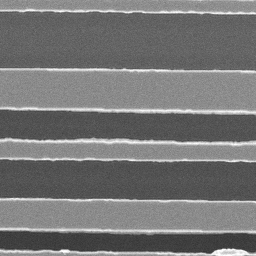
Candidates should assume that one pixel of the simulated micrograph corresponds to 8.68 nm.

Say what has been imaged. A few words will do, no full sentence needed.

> lines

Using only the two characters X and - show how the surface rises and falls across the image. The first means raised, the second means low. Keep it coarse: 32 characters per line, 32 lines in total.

XXXXXXXXXXXXXXXXXXXXXXXXXXXXXXXX
---------------XX-XXXXXXXXXXXXXX
--------------------------------
--------------------------------
--------------------------------
--------------------------------
--------------------------------
--------------------------------
--------------------------------
XXXXXXXXXXXXXXXXXXXXXXXXXXXXXXXX
XXXXXXXXXXXXXXXXXXXXXXXXXXXXXXXX
XXXXXXXXXXXXXXXXXXXXXXXXXXXXXXXX
XXXXXXXXXXXXXXXXXXXXXXXXXXXXXXXX
XXXXXXXXXXXXXXXXXXXXXXXXXXXXXXXX
--------------------------------
--------------------------------
--------------------------------
XX------------------------------
XXXXXXXXXXXXXXXXXXXXXXXXXXXXXXXX
XXXXXXXXXXXXXXXXXXXXXXXXXXXXXXXX
--------------------------------
--------------------------------
--------------------------------
--------------------------------
--------------------------------
XXXXXXXXXXXXXXXXXXXXXXXXXXXXXXXX
XXXXXXXXXXXXXXXXXXXXXXXXXXXXXXXX
XXXXXXXXXXXXXXXXXXXXXXXXXXXXXXXX
XXXXXXXXXXXXXXXXXXXXXXXXXXXXXXXX
--------------------------------
--------------------------------
XXXXXXXXXX-----------------XXXX-